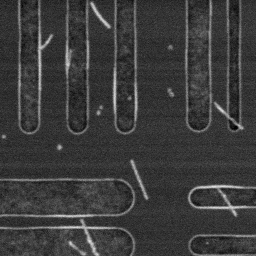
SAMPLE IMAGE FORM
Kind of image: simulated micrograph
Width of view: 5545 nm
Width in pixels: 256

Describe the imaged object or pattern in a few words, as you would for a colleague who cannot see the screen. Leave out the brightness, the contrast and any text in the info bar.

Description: groups of lines, slits or small figures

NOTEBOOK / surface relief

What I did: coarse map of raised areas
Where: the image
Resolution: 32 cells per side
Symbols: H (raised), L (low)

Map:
HHLLLHHHLLLHHHLLLHHHHHHLLLHHLLHH
HHLLLHHHLLLHHHLLLHHHHHHLLLHHLLHH
HHLLLHHHLLLHHHLLLHHHHHHLLLHHLLHH
HHLLLHHHLLLHHHLLLHHHHHHLLLHHLLHH
HHLLLHHHLLLHHHLLLHHHHHHLLLHHLLHH
HHLLLHHHLLLHHHLLLHHHHHHLLLHHLLHH
HHLLLHHHLLLHHHLLLHHHHHHLLLHHLLHH
HHLLLHHHLLLHHHLLLHHHHHHLLLHHLLHH
HHLLLHHHHLLHHHLLLHHHHHHLLLHHLLHH
HHLLLHHHLLLHHHLLLHHHHHHLLLHHLLHH
HHLLLHHHLLLHHHLLLHHHHHHLLLHHLLHH
HHLLLHHHLLLHHHLLLHHHHHHLLLHHLLHH
HHLLLHHHLLLHHHLLLHHHHHHLLLHHLLHH
HHLLLHHHLLLHHHLLLHHHHHHLLLHHLLHH
HHLLLHHHLLLHHHLLLHHHHHHLLLHHHLHH
HHHLLHHHHLLHHHLLLHHHHHHHLLHHHLHH
HHHLHHHHHLHHHHHLHHHHHHHHHHHHHHHH
HHHHHHHHHHHHHHHHHHHHHHHHHHHHHHHH
HHHHHHHHHHHHHHHHHHHHHHHHHHHHHHHH
HHHHHHHHHHHHHHHHHHHHHHHHHHHHHHHH
HHHHHHHHHHHHHHHHHHHHHHHHHHHHHHHH
HHHHHHHHHHHHHHHHHHHHHHHHHHHHHHHH
LLHHHHLLLLHHLLLHHHHHHHHHHHHHHHHH
LLLLLLLLLLLLLLLLHHHHHHHHHLLLLLLH
LLLLLLLLLLLLLLLLLHHHHHHHLLLLLLLL
LLLLLLLLLLLLLLLLLHHHHHHHLLLLLLLL
LLLLLLLLLLLLLLLLHHHHHHHHHHHHHHHH
HHHHHHHHHHHHHHHHHHHHHHHHHHHHHHHH
LLLLLLLLLLHLLLLHHHHHHHHHHHHHHHHH
LLLLLLLLLLLLLLLLHHHHHHHHHLLLLLLL
LLLLLLLLLLLLLLLLLHHHHHHHLLLLLLLL
LLLLLLLLLLLLLLLLLHHHHHHHLLLLLLLL